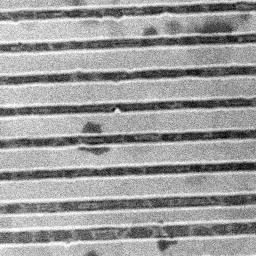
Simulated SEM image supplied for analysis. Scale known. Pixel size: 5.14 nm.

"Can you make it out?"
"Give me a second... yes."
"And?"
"parallel lines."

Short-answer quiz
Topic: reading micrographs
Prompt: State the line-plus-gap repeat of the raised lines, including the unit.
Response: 0.163 um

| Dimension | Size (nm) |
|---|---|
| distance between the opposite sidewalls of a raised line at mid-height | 108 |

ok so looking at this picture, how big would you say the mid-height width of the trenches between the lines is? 0.0539 um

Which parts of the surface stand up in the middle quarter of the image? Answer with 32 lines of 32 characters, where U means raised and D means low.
UUUUUUUUUUUUUUUUUUUUUUUUUUUUUUUU
UUUDUUUUUUUUUDDUUUUDDDDDDDDDDDDD
DDDDDDDDDDDDDDDDDDDDDDDDDDDDDDDD
DDDDDDDDDDDDDDDDDDDDDDDDDDDDDUUU
DDDDDDDDDDDDDDUUUUUUUUUUUUUUUUUU
UUUUUUUUUUUUUUUUUUUUUUUUUUUUUUUU
UUUUUUUUUUUUUUUUUUUUUUUUUUUUUUUU
UUUUUUUUUUUUUUUUUUUUUUUUUUUUUUUU
UUUUUUUUUUUUUUUUUUUUUUUUUUUUUUUU
UUUUUUUUUUUUUUUDDDDDDDDDDDDDDDDD
DDDDDDDDDDDDDDDDDDDDDDDDDDDDDDDD
DDDDDDDDDDDDDUDDDDDDDDDDDDDDDDDU
DDDDDUUDDDDUUUUUUUUUUUUUUUUUUUUU
UUUUUUUUUUUUUUUUUUUUUUUUUUUUUUUU
UUUUUUUUUUUUUUUUUUUUUUUUUUUUUUUU
UUUUUUUUUUUUUUUUUUUUUUUUUUUUUUUU
UUUUUUUUUUUUUUUUUUUUUUUUUUUUUUUU
UUUUUUUUUUUUDDDDDDDDDDDDDDDDDDDD
DDDDDDDDDDDDDDDDDDDDDDDDDDDDDDDD
DDDDDDDDDDDDDDDDDDDDDDDDDDDDDDDD
DDDUUUDDUUUUUUUUUUUUUUUUUUUUUUUU
UUUUUUUUUUUUUUUUUUUUUUUUUUUUUUUU
UUUUUUUUUUUUUUUUUUUUUUUUUUUUUUUU
UUUUUUUUUUUUUUUUUUUUUUUUUUUUUUUU
UUUUUUUUUUUUUUUUUUUUUUUUUUUUUUUU
UUUUUUUUUUUUDDDDDDDDDDDDDDDDDDDD
DDDDDDDDDDDDDDDDDDDDDDDDDDDDDDDD
DDDDDDDDDDDDDDDDDDDDDDDDDDDDDDDD
DDDDUUUUUDUUUUUUUUUUUUUUUUUUUUUU
UUUUUUUUUUUUUUUUUUUUUUUUUUUUUUUU
UUUUUUUUUUUUUUUUUUUUUUUUUUUUUUUU
UUUUUUUUUUUUUUUUUUUUUUUUUUUUUUUU